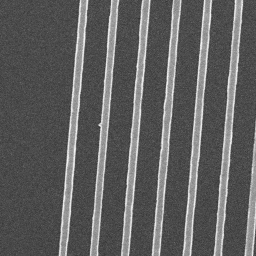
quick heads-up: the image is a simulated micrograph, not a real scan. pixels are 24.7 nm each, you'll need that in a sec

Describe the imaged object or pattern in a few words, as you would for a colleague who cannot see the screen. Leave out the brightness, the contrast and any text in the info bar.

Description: parallel lines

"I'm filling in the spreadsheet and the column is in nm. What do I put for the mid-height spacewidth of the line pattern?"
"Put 599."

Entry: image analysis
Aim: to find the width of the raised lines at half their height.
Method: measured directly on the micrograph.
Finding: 0.169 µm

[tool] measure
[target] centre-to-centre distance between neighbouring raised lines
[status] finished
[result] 762 nanometres